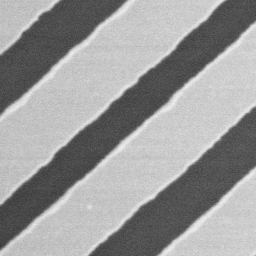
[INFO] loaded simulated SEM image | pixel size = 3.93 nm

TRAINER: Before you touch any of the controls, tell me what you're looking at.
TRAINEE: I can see lines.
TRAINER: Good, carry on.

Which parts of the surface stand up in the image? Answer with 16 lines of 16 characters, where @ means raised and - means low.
@@@-----@@@@@---
@@----@@@@@@----
@----@@@@@@----@
----@@@@@@----@@
---@@@@@@----@@@
--@@@@@@---@@@@@
-@@@@@@---@@@@@@
@@@@@@---@@@@@@-
@@@@@---@@@@@@--
@@@@---@@@@@@---
@@@---@@@@@@----
@----@@@@@@----@
----@@@@@-----@@
---@@@@@-----@@@
-@@@@@@-----@@@@
@@@@@@----@@@@@@